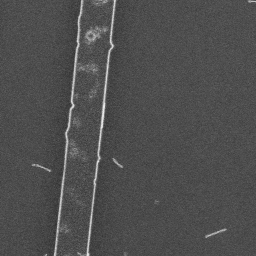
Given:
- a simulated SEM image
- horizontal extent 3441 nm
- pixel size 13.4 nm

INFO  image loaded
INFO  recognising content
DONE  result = one or a few lines or trenches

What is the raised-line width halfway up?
446 nm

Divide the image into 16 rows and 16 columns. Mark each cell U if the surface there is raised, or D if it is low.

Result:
DDDDDUUDDDDDDDDD
DDDDDUUDDDDDDDDD
DDDDDUUDDDDDDDDD
DDDDDUUDDDDDDDDD
DDDDDUUDDDDDDDDD
DDDDDUUDDDDDDDDD
DDDDUUUDDDDDDDDD
DDDDUUDDDDDDDDDD
DDDDUUDDDDDDDDDD
DDDDUUDDDDDDDDDD
DDDDUUDDDDDDDDDD
DDDDUUDDDDDDDDDD
DDDDUUDDDDDDDDDD
DDDDUUDDDDDDDDDD
DDDDUUDDDDDDDDDD
DDDUUDDDDDDDDDDD